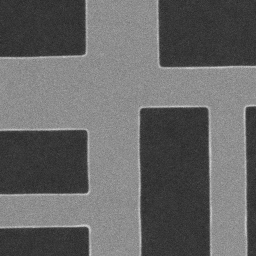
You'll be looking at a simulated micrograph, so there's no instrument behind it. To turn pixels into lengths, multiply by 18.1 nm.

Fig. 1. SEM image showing groups of lines, slits or small figures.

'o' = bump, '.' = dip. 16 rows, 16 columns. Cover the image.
.....ooooo......
.....ooooo......
.....ooooo......
.....ooooo......
oooooooooooooooo
oooooooooooooooo
oooooooooooooooo
ooooooooo....oo.
.....oooo....oo.
......ooo....oo.
......ooo....oo.
......ooo....oo.
ooooooooo....oo.
ooooooooo....oo.
......ooo....oo.
......ooo....oo.